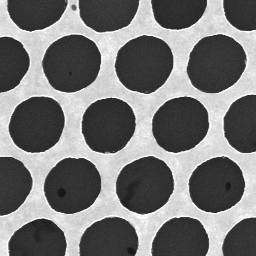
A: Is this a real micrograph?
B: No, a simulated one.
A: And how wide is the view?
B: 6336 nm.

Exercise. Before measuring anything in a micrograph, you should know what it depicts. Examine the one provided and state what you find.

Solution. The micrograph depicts a regular array of holes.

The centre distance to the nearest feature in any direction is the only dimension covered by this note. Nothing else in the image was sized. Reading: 1.74 um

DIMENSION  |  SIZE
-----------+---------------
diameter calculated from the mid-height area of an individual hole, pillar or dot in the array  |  57.1 pixels